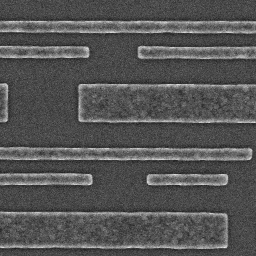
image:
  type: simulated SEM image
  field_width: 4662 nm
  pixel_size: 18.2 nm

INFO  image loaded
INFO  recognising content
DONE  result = wiring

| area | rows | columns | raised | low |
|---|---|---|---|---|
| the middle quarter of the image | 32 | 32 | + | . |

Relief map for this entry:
................................
................................
................................
................................
................................
....++++++++++++++++++++++++++++
....++++++++++++++++++++++++++++
....++++++++++++++++++++++++++++
....++++++++++++++++++++++++++++
....++++++++++++++++++++++++++++
....++++++++++++++++++++++++++++
....++++++++++++++++++++++++++++
....++++++++++++++++++++++++++++
....++++++++++++++++++++++++++++
................................
................................
................................
................................
................................
................................
................................
++++++++++++++++++++++++++++++++
++++++++++++++++++++++++++++++++
++++++++++++++++++++++++++++++++
................................
................................
................................
................................
+++++++..............+++++++++++
+++++++..............+++++++++++
................................
................................